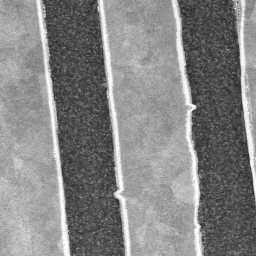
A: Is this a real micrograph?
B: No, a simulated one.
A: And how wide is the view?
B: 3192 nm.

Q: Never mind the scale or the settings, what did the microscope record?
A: one or a few lines or trenches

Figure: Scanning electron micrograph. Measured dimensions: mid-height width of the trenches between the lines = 759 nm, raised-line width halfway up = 914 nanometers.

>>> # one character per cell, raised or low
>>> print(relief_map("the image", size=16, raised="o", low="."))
oo....ooooo....o
ooo...ooooo....o
ooo....oooo....o
ooo....oooo....o
ooo....oooo....o
ooo....ooooo...o
ooo....ooooo...o
ooo....ooooo...o
ooo....ooooo....
oooo...ooooo....
oooo...ooooo....
oooo....oooo....
oooo....oooo....
oooo....oooo....
oooo....oooo....
oooo....oooo....